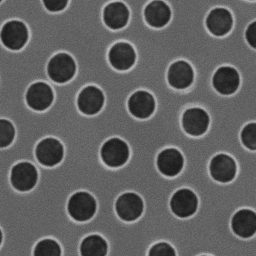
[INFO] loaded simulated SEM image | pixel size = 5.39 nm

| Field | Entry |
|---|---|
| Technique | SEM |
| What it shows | a regular array of holes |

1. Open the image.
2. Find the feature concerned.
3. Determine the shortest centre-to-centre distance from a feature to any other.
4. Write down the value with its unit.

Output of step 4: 241 nm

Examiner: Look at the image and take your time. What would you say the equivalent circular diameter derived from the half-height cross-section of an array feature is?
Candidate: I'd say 157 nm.